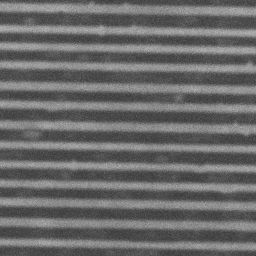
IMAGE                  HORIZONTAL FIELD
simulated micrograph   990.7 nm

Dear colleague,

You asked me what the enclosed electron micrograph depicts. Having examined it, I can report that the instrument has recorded parallel lines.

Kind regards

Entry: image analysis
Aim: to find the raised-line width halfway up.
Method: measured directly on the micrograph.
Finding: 23.2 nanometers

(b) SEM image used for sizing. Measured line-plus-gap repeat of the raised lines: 75.8 nm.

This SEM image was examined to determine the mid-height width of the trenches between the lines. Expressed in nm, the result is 52.7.